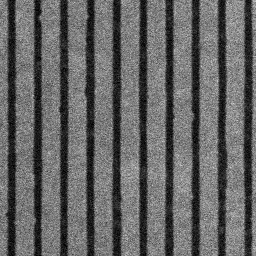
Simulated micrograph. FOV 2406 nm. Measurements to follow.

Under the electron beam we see parallel lines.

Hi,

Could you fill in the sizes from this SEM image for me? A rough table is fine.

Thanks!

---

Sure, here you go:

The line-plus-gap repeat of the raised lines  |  247 nm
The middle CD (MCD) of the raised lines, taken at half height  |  0.167 um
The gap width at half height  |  78.7 nm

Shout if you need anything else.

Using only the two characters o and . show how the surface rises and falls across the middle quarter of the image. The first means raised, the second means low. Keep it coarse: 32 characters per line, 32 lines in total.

.oooo...oooo..oooo...oooo..ooooo
.oooo...oooo..oooo...oooo..ooooo
.oooo...oooo..oooo...oooo..ooooo
.oooo...oooo..ooooo..oooo..ooooo
.oooo...oooo..ooooo..oooo..ooooo
.oooo...oooo..ooooo..oooo..ooooo
.oooo...oooo..ooooo..oooo..ooooo
.oooo...oooo..ooooo..oooo..ooooo
.oooo...oooo..ooooo..oooo..ooooo
.oooo...oooo..ooooo..oooo..ooooo
.oooo...oooo..ooooo..oooo..ooooo
.ooooo..oooo..ooooo..oooo..ooooo
.ooooo..oooo..ooooo..oooo...oooo
.ooooo..oooo..ooooo..oooo...oooo
.ooooo..oooo..ooooo..oooo..ooooo
.ooooo..oooo..ooooo..oooo..ooooo
.oooo...oooo..ooooo..oooo..ooooo
.oooo...oooo..ooooo..oooo..ooooo
.oooo...oooo..ooooo..oooo..ooooo
.oooo...oooo..ooooo..oooo..ooooo
.oooo...oooo..ooooo..oooo...oooo
.oooo...oooo..ooooo..oooo...oooo
.oooo...oooo..ooooo..oooo..ooooo
.oooo...oooo..ooooo..oooo..ooooo
.oooo...oooo..ooooo..oooo..ooooo
.oooo...oooo..ooooo..oooo..ooooo
.oooo...oooo..ooooo..oooo..ooooo
.oooo...oooo..ooooo..oooo..ooooo
.oooo...oooo..ooooo..oooo..ooooo
.oooo...oooo..ooooo..oooo..ooooo
.oooo...oooo..ooooo..oooo..ooooo
.oooo...oooo..ooooo..oooo..ooooo